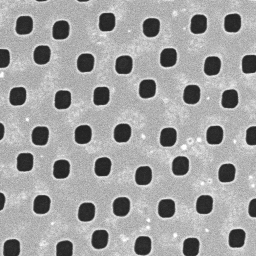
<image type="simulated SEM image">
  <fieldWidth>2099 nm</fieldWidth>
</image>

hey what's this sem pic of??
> a regular array of holes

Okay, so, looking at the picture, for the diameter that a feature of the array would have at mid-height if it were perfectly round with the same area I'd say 152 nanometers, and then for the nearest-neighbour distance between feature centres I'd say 295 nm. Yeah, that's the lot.